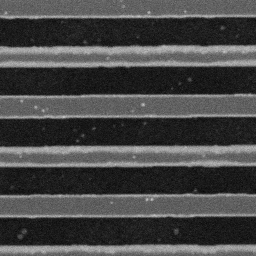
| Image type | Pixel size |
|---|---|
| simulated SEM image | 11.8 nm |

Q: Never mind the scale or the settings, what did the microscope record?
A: lines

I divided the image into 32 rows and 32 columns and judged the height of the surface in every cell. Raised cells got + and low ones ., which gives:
++++++++++++++++++++++++++++++++
++++++++++++++++++++++++++++++++
................................
................................
................................
................................
++++++++++++++++++++++++++++++++
++++++++++++++++++++++++++++++++
................................
................................
................................
................................
++++++++++++++++++++++++++++++++
++++++++++++++++++++++++++++++++
++++++++++++++++++++++++++++++++
................................
................................
................................
........++++++++++++++++++++++++
++++++++++++++++++++++++++++++++
++++++++++++++++++++++++++++++++
................................
................................
................................
++++++++++++++++++++++++++++++++
++++++++++++++++++++++++++++++++
++++++++++++++++++++++++++++++++
................................
................................
................................
................................
++++++++++++++++++++++++++++++++